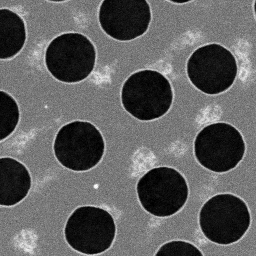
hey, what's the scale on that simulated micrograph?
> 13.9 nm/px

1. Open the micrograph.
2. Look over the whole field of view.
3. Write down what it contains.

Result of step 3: a regular array of holes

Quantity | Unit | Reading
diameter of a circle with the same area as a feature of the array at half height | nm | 694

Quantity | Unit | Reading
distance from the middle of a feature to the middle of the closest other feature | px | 71.1